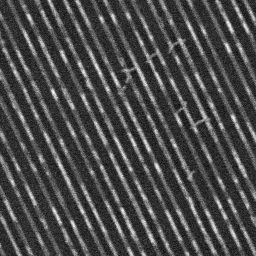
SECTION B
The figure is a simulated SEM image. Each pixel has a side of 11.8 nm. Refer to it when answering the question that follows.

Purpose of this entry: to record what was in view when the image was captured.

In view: parallel lines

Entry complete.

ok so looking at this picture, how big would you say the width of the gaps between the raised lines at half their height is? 0.101 micrometres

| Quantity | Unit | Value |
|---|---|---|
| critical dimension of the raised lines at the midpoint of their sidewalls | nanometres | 30.6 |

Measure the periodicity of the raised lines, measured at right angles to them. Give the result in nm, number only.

149